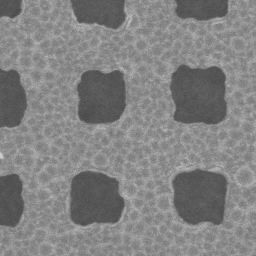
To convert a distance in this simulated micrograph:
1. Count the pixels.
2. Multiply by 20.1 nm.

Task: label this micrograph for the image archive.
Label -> holes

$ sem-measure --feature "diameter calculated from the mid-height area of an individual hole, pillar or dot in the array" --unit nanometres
1170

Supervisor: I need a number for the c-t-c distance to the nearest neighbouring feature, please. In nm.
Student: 2000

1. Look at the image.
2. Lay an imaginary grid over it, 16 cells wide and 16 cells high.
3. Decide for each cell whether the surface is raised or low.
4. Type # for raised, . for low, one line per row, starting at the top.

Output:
.####...###...##
######..########
################
################
.####..####...##
..###...###...##
..###...###...##
.####..####...##
################
################
################
.###...####...##
.###....###...##
.###....###...##
################
################